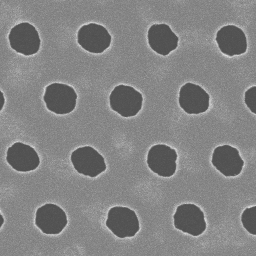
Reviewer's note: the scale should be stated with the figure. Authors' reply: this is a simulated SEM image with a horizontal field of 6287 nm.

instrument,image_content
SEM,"a regular array of holes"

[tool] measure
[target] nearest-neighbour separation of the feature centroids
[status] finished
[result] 1.63 micrometres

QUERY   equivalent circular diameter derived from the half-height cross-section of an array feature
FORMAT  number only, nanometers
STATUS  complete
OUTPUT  773